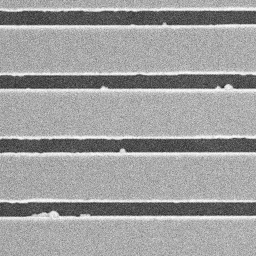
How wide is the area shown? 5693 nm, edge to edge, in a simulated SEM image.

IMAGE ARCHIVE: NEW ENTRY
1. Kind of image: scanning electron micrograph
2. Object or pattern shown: lines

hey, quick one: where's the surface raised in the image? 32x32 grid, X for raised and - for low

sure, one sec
XXXXXXXXXXXXXXXXXXXXXXXXXXXXXXXX
--------------------------------
--------------------------------
XXXXXXXXXXXXXXXXXXXXXXXXXXXXXXXX
XXXXXXXXXXXXXXXXXXXXXXXXXXXXXXXX
XXXXXXXXXXXXXXXXXXXXXXXXXXXXXXXX
XXXXXXXXXXXXXXXXXXXXXXXXXXXXXXXX
XXXXXXXXXXXXXXXXXXXXXXXXXXXXXXXX
XXXXXXXXXXXXXXXXXXXXXXXXXXXXXXXX
--------------------------------
--------------------------------
XXXXXXXXXXXXXXXXXXXXXXXXXXXXXXXX
XXXXXXXXXXXXXXXXXXXXXXXXXXXXXXXX
XXXXXXXXXXXXXXXXXXXXXXXXXXXXXXXX
XXXXXXXXXXXXXXXXXXXXXXXXXXXXXXXX
XXXXXXXXXXXXXXXXXXXXXXXXXXXXXXXX
XXXXXXXXXXXXXXXXXXXXXXXXXXXXXXXX
--------------------------------
--------------------------------
XXXXXXXXXXXXXXXXXXXXXXXXXXXXXXXX
XXXXXXXXXXXXXXXXXXXXXXXXXXXXXXXX
XXXXXXXXXXXXXXXXXXXXXXXXXXXXXXXX
XXXXXXXXXXXXXXXXXXXXXXXXXXXXXXXX
XXXXXXXXXXXXXXXXXXXXXXXXXXXXXXXX
XXXXXXXXXXXXXXXXXXXXXXXXXXXXXXXX
--------------------------------
--------------------------------
XXXXXXXXXXXXXXXXXXXXXXXXXXXXXXXX
XXXXXXXXXXXXXXXXXXXXXXXXXXXXXXXX
XXXXXXXXXXXXXXXXXXXXXXXXXXXXXXXX
XXXXXXXXXXXXXXXXXXXXXXXXXXXXXXXX
XXXXXXXXXXXXXXXXXXXXXXXXXXXXXXXX